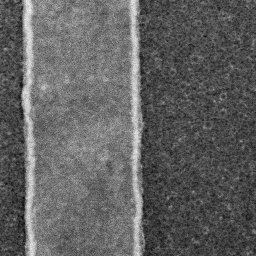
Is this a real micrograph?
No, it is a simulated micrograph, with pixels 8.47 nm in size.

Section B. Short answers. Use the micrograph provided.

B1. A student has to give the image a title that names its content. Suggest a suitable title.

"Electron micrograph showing one or a few lines or trenches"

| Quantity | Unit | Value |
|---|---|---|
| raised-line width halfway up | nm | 893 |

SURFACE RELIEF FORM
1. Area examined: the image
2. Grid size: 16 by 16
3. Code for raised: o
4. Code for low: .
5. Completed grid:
..oooooo........
..oooooo........
..oooooo........
..oooooo........
..oooooo........
..oooooo........
..oooooo........
..oooooo........
..ooooooo.......
..oooooo........
..oooooo........
..oooooo........
..ooooooo.......
..ooooooo.......
..ooooooo.......
..ooooooo.......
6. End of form